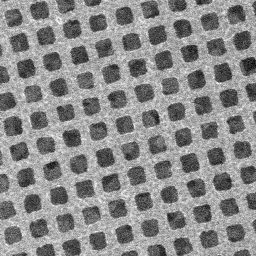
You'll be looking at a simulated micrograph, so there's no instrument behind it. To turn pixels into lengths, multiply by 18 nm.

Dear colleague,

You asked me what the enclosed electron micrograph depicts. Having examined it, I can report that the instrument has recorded a regular array of raised bodies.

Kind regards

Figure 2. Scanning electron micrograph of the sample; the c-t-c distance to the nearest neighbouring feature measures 0.469 microns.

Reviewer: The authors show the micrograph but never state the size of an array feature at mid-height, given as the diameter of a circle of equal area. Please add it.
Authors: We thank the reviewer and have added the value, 364 nm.